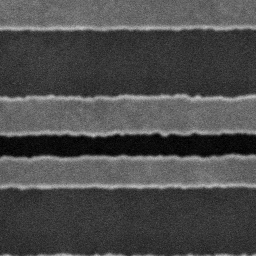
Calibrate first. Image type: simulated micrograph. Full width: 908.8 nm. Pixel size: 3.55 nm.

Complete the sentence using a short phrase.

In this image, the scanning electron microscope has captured lines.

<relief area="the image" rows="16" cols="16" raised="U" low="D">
UUUUUUUUUUUUUUUU
UUUUUUUUUUUUUUUU
DDDDDDDDDDDDDDDD
DDDDDDDDDDDDDDDD
DDDDDDDDDDDDDDDD
DDDDDDDDDDDDDDDD
UUUUUUUUUUUUUUUU
UUUUUUUUUUUUUUUU
DDDDDDDDDDDDDDDD
DDDDDDDDDDDDDDDD
UUUUUUUUUUUUUUUU
UUUUUUUUUUUUUUUU
DDDDDDDDDDDDDDDD
DDDDDDDDDDDDDDDD
DDDDDDDDDDDDDDDD
DDDDDDDDDDDDDDDD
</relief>